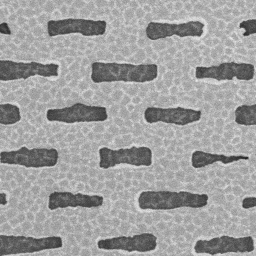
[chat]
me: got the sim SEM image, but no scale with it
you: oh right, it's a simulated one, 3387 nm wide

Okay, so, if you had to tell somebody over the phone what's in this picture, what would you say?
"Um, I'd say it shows a regular array of holes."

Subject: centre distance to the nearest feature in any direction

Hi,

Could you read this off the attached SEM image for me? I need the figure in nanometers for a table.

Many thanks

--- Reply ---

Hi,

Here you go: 817